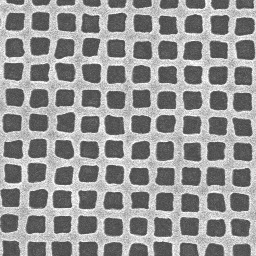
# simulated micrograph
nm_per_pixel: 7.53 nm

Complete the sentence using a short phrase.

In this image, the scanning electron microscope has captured a regular array of holes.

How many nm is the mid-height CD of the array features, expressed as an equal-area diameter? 152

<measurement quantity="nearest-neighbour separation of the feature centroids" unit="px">24.1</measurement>